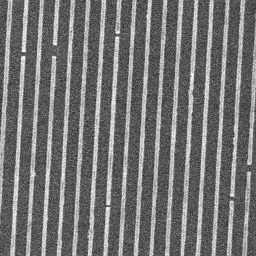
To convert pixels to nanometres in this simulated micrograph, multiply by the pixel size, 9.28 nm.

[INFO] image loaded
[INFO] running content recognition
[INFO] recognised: parallel lines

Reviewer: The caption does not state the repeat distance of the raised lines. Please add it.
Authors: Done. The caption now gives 143 nanometers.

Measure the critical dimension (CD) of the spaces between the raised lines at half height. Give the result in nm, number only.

116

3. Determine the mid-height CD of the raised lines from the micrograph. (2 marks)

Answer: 26.6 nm